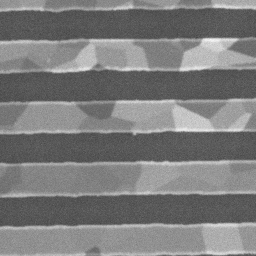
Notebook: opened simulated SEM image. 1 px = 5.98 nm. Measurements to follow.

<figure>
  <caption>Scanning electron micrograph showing lines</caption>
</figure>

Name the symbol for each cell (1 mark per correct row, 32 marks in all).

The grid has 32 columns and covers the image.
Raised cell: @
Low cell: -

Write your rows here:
@@@@@@@@@@@@@@@@@@@@@@@@@@@@@@@@
--------------------------------
--------------------------------
--------------------------------
--------------------------------
@@@@@@@@@@@@@@@@@@@@@@@@@@@@@@@@
@@@@@@@@@@@@@@@@@@@@@@@@@@@@@@@@
@@@@@@@@@@@@@@@@@@@@@@@@@@@@@@@@
@@@@@@@@@@@@@@@@@@@@@@@@@@@@@@@@
--------------------------------
--------------------------------
--------------------------------
----------------------------@@@@
@@@@@@@@@@@@@@@@@@@@@@@@@@@@@@@@
@@@@@@@@@@@@@@@@@@@@@@@@@@@@@@@@
@@@@@@@@@@@@@@@@@@@@@@@@@@@@@@@@
@@@@@@@@@@--@@---@@-------------
--------------------------------
--------------------------------
--------------------------------
@--@@@@@@@@@@@@@@@@@@@@@@@@@@@@@
@@@@@@@@@@@@@@@@@@@@@@@@@@@@@@@@
@@@@@@@@@@@@@@@@@@@@@@@@@@@@@@@@
@@@@@@@@@@@@@@@@@@@@@@@@@@@@@@@@
@@@------@----------------------
--------------------------------
--------------------------------
--------------------------------
@@@@@@@@@@@@@@@@@@@@@@@@@@@@@@@@
@@@@@@@@@@@@@@@@@@@@@@@@@@@@@@@@
@@@@@@@@@@@@@@@@@@@@@@@@@@@@@@@@
@@@@@@@@@@@@@@@@@@@@@@@@@@@@@@@@